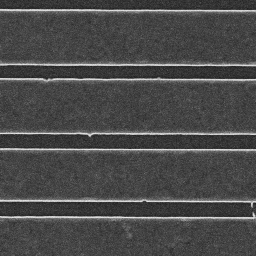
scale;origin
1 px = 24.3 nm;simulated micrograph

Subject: one or a few lines or trenches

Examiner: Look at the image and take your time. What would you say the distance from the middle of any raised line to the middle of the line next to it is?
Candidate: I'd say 1680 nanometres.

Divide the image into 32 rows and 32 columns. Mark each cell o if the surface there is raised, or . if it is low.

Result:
................................
oooooooooooooooooooooooooooooooo
oooooooooooooooooooooooooooooooo
oooooooooooooooooooooooooooooooo
oooooooooooooooooooooooooooooooo
oooooooooooooooooooooooooooooooo
oooooooooooooooooooooooooooooooo
oooooooooooooooooooooooooooooooo
................................
................................
oooooooooooooooooooooooooooooooo
oooooooooooooooooooooooooooooooo
oooooooooooooooooooooooooooooooo
oooooooooooooooooooooooooooooooo
oooooooooooooooooooooooooooooooo
oooooooooooooooooooooooooooooooo
oooooooooooooooooooooooooooooooo
................................
................................
oooooooooooooooooooooooooooooooo
oooooooooooooooooooooooooooooooo
oooooooooooooooooooooooooooooooo
oooooooooooooooooooooooooooooooo
oooooooooooooooooooooooooooooooo
oooooooooooooooooooooooooooooooo
................................
................................
oooooooooooooooooooooooooooooooo
oooooooooooooooooooooooooooooooo
oooooooooooooooooooooooooooooooo
oooooooooooooooooooooooooooooooo
oooooooooooooooooooooooooooooooo